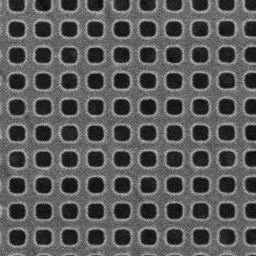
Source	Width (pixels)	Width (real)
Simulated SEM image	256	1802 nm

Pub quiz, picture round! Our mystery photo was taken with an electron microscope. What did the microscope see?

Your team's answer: a regular array of holes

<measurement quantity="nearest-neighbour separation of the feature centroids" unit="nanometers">182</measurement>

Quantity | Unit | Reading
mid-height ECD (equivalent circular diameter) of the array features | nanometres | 126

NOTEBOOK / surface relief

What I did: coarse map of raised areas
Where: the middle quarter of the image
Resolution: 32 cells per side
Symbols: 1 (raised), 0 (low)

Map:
11111111111111111111111111111111
11111111111111111111111111111111
00011100011110001110000111000111
00011100001100000110000110000011
00001100001100000110000110000011
00011100001100001110000111000011
10111111011111111111101111111111
11111111111111111111111111111111
11111111111111111111111111111111
00011100001100001110000111000011
00001100001100000110000110000011
00001100001100000110000110000011
00011100001110001110000111000111
11111111111111111111111111111111
11111111111111111111111111111111
00011100011110001110000111000111
00001100001100000110000110000011
00001100001100000110000110000011
00011100001110000110000111000011
11111111111111111111111111111111
11111111111111111111111111111111
11111111111111111111111111111111
00011100001110000110000111000011
00001100001100000110000110000011
00001100001100000110000110000011
00011100011110001111000111000111
11111111111111111111111111111111
11111111111111111111111111111111
00011110011110001111000111000111
00001100001100000110000110000011
00001100001100000110000110000011
00011100001100000110000111000011